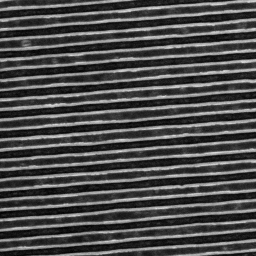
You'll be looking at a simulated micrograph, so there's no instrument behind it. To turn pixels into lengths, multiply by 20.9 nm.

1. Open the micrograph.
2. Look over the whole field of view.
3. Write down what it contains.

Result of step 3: parallel lines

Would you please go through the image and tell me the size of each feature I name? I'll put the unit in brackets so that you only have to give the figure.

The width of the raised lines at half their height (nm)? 211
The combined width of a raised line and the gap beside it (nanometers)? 418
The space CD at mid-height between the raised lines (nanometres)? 196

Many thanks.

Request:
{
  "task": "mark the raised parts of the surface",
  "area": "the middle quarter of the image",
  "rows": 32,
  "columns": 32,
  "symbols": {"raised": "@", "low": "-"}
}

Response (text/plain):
----------------------------@@-@
---------------@@-@@@@@@@@@@@@@@
-----@@@@@@@@@@@@@@@@@@@@@@@@@@@
@@@@@@@@@@@@@@@@@@@@@@@---------
@@@@@@@@@@-@--------------------
-----------------------------@@@
----------------@@@@@@@@@@@@@@@@
------@@@@@@@@@@@@@@@@@@@@@@@@@@
@@@@@@@@@@@@@@@@@@@@@@@---------
@@@@@@@@--@---------------------
------------------------------@@
-----------------@@@@@@@@@@@@@@@
----@@@@@@@@@@@@@@@@@@@@@@@@@@@@
@@@@@@@@@@@@@@@@@@@@@@@@--------
@@@@@@@@@@@---------------------
-------------------------------@
---------------@@@@@@@@@@@@@@@@@
--@@-@@@@@@@@@@@@@@@@@@@@@@@@@@@
@@@@@@@@@@@@@@@@@@@@@@----------
@@@@@@@@@@@@--------------------
-----------------------------@@-
----------------@@@@@@@@@@@@@@@@
------@@@@@@@@@@@@@@@@@@@@@@@@@@
@@@@@@@@@@@@@@@@@@@@@@----------
@@@@@@@@@@----------------------
------------------------------@@
-----------------@@@@@@@@@@@@@@@
----@@@@@@@@@@@@@@@@@@@@@@@@@@@@
@@@@@@@@@@@@@@@@@@@@@-----------
@@@@@@@@@-----------------------
-------------------------------@
------------------@@@@@@@@@@@@@@